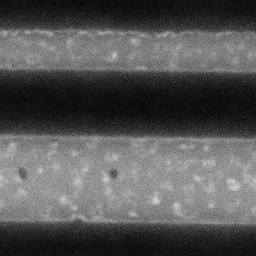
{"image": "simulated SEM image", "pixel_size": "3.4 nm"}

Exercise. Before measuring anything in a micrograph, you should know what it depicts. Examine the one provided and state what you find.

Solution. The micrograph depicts one or a few lines or trenches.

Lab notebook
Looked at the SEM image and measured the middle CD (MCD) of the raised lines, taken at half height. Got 242 nm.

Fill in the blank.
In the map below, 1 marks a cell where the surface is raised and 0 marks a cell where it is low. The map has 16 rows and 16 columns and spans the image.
1111111111111111
1111111111111111
0000000000000000
0000000000000000
1111111111111111
1111111111111111
1111111111111111
1111111111111111
1111111111111111
0000000000000000
0000000000000000
0000000000000000
0000000000000000
0000000000000000
1111111111111111
1111111111111111